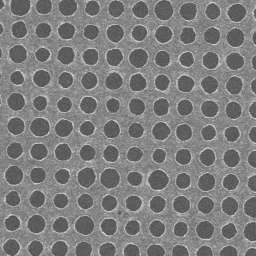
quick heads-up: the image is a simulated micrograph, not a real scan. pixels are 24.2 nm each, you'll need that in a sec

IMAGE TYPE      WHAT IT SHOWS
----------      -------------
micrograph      a regular array of holes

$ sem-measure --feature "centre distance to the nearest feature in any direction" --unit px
23.7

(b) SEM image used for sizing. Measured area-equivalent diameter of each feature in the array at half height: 16.8 pixels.